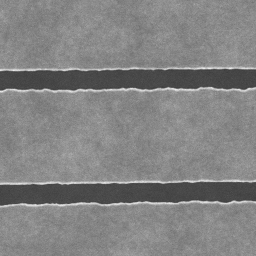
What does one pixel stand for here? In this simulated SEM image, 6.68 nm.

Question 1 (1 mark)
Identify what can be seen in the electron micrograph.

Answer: lines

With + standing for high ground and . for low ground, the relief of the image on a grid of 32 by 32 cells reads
++++++++++++++++++++++++++++++++
++++++++++++++++++++++++++++++++
++++++++++++++++++++++++++++++++
++++++++++++++++++++++++++++++++
++++++++++++++++++++++++++++++++
++++++++++++++++++++++++++++++++
++++++++++++++++++++++++++++++++
++++++++++++++++++++++++++++++++
++++++++++++++++++++++++++++++++
................................
................................
++++++++++++++++++++++++++++++++
++++++++++++++++++++++++++++++++
++++++++++++++++++++++++++++++++
++++++++++++++++++++++++++++++++
++++++++++++++++++++++++++++++++
++++++++++++++++++++++++++++++++
++++++++++++++++++++++++++++++++
++++++++++++++++++++++++++++++++
++++++++++++++++++++++++++++++++
++++++++++++++++++++++++++++++++
++++++++++++++++++++++++++++++++
++++++++++++++++++++++++++++++++
................................
................................
..++.++.++++++++++++++++++++++++
++++++++++++++++++++++++++++++++
++++++++++++++++++++++++++++++++
++++++++++++++++++++++++++++++++
++++++++++++++++++++++++++++++++
++++++++++++++++++++++++++++++++
++++++++++++++++++++++++++++++++